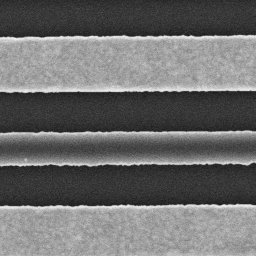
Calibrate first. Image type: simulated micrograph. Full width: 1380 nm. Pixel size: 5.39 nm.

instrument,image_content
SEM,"lines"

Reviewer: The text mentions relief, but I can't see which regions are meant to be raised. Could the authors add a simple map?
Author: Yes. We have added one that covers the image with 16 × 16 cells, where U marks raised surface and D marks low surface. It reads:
DDDDDDDDDDDDDDDD
DDDDDDDDDDDDDDDD
UUUUUUUUUUUUUUUU
UUUUUUUUUUUUUUUU
UUUUUUUUUUUUUUUU
UUUUUUUUUUUUUUUU
DDDDDDDDDDDDDDDD
DDDDDDDDDDDDDDDD
UUUUUUUUUUUUUUUU
UUUUUUUUUUUUUUUU
DDDDDDDDDDDDDDDD
DDDDDDDDDDDDDDDD
DDDDDDDDDDDDDDDD
UUUUUUUUUUUUUUUU
UUUUUUUUUUUUUUUU
UUUUUUUUUUUUUUUU